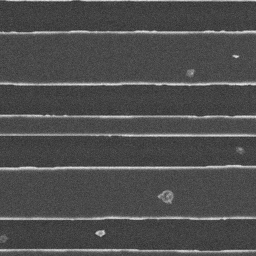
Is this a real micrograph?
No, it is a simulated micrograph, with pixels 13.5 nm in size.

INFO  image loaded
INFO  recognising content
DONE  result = lines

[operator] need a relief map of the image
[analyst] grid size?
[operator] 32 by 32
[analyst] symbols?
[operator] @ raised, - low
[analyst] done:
--------------------------------
--------------------------------
--------------------------------
--------------------------------
@@@@@@@@@@@@@@@@@@@@@@@@@@@@@@@@
@@@@@@@@@@@@@@@@@@@@@@@@@@@@@@@@
@@@@@@@@@@@@@@@@@@@@@@@@@@@@@@@@
@@@@@@@@@@@@@@@@@@@@@@@@@@@@@@@@
@@@@@@@@@@@@@@@@@@@@@@@@@@@@@@@@
@@@@@@@@@@@@@@@@@@@@@@@@@@@@@@@@
--@@@@@@@@@@@@@----@-@@@@@----@@
--------------------------------
--------------------------------
--------------------------------
@@@@@---------------------------
@@@@@@@@@@@@@@@@@@@@@@@@@@@@@@@@
@@@@@@@@@@@@@@@@@@@@@@@@@@@@@@@@
--------------------------------
--------------------------------
--------------------------------
--------------------------------
@@@@@@@@@@@@@@@@@@@@@@@@@@@@@@@@
@@@@@@@@@@@@@@@@@@@@@@@@@@@@@@@@
@@@@@@@@@@@@@@@@@@@@@@@@@@@@@@@@
@@@@@@@@@@@@@@@@@@@@@@@@@@@@@@@@
@@@@@@@@@@@@@@@@@@@@@@@@@@@@@@@@
@@@@@@@@@@@@@@@@@@@@@@@@@@@@@@@@
--------------------------------
--------------------------------
--------------------------------
--------------------------------
@@@@@@@@@@@@@@@@@@@@@@@@@@@@@@@@